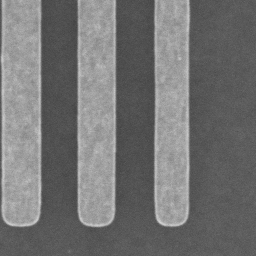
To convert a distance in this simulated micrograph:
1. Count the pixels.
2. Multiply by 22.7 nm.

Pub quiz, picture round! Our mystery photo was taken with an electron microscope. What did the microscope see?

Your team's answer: wiring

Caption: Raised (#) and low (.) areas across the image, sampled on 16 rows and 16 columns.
###..##...##....
###..##...##....
##...##...##....
##...##...##....
##...##...##....
##...##...##....
##...##...##....
##...##...##....
###..##...##....
###..##...##....
###..##...##....
###..##...##....
##...##...##....
##...##...##....
................
................